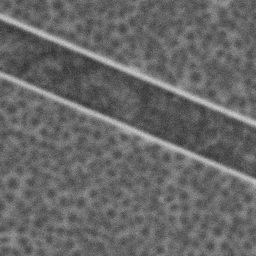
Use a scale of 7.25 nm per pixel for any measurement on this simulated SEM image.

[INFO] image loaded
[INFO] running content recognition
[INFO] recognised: one or a few lines or trenches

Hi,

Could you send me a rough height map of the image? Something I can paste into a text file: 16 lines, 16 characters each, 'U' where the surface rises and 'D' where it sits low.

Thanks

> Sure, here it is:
UUUUUUUUUUUUUUUU
DUUUUUUUUUUUUUUU
DDDDUUUUUUUUUUUU
DDDDDDUUUUUUUUUU
DDDDDDDDUUUUUUUU
UUDDDDDDDDDUUUUU
UUUUDDDDDDDDDUUU
UUUUUUUDDDDDDDDU
UUUUUUUUUDDDDDDD
UUUUUUUUUUUUDDDD
UUUUUUUUUUUUUUDD
UUUUUUUUUUUUUUUU
UUUUUUUUUUUUUUUU
UUUUUUUUUUUUUUUU
UUUUUUUUUUUUUUUU
UUUUUUUUUUUUUUUU